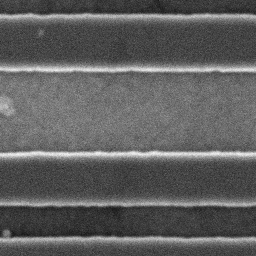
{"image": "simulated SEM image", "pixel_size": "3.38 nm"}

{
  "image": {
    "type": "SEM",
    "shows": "lines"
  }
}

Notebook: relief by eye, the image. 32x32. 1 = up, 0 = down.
00000000000000000000000000000000
00000000000000000000000000000000
11111111111111111111111111111111
11111111111111111111111111111111
11111111111111111111111111111111
11111111111111111111111111111111
11111111111111111111111111111111
11111111111111111111111111111111
11111111111111111111111111111111
00000000000000000000000000000000
00000000000000000000000000000000
00000000000000000000000000000000
00000000000000000000000000000000
00000000000000000000000000000000
00000000000000000000000000000000
00000000000000000000000000000000
00000000000000000000000000000000
00000000000000000000000000000000
00000000000000000000000000000000
11111111111111111111111111111111
11111111111111111111111111111111
11111111111111111111111111111111
11111111111111111111111111111111
11111111111111111111111111111111
11111111111111111111111111111111
11111111111111111111111111111111
00000000000000000000000000000000
00000000000000000000000000000000
00000000000000000000000000000000
00000000000000000000000000000000
11111111111111111111111111111111
11111111111111111111111111111111